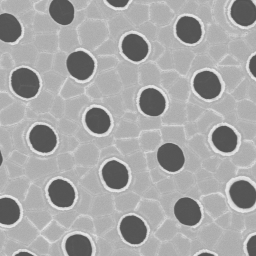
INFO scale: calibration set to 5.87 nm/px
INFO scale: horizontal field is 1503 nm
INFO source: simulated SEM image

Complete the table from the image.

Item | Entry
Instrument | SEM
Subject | a regular array of holes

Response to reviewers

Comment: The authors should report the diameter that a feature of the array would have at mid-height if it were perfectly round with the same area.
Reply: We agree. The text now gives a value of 27.4 px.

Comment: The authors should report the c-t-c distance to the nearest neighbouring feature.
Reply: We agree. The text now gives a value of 56.9 px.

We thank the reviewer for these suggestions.